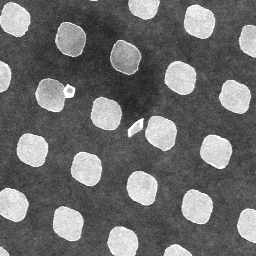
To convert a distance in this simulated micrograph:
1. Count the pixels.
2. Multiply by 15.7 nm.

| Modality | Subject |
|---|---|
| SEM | a regular array of raised bodies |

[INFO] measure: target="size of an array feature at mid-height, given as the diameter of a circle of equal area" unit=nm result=499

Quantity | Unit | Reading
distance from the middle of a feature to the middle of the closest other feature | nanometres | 905